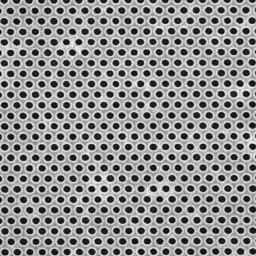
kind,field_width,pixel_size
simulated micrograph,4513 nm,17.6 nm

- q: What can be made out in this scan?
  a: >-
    a regular array of holes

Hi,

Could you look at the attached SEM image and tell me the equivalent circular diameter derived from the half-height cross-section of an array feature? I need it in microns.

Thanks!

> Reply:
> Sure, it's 0.129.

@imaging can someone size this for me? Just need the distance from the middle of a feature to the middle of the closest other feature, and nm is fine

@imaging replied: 209